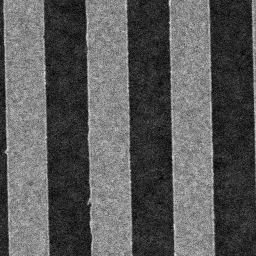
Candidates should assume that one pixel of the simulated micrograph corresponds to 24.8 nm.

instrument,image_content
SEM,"one or a few lines or trenches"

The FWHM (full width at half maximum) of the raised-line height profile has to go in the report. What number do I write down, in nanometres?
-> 968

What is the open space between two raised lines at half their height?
1070 nm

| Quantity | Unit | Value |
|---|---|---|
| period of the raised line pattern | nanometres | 2060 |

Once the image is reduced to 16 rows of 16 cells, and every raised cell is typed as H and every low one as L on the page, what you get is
HHHLLHHHLLLHHLLL
HHHLLHHHLLLHHLLL
HHHLLHHHLLLHHLLL
HHHLLHHHLLLHHLLL
HHHLLHHHLLLHHLLL
HHHLLLHHLLLHHLLL
HHHLLLHHLLLHHLLL
HHHLLLHHLLLHHLLL
HHHLLLHHLLLHHLLL
HHHLLLHHLLLHHLLL
HHHLLLHHLLLHHLLL
HHHLLLHHLLLHHLLL
LHHLLLHHLLLHHLLL
LHHLLLHHLLLHHLLL
LHHLLLHHLLLHHLLL
LHHLLLHHLLLHHLLL